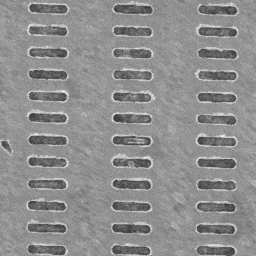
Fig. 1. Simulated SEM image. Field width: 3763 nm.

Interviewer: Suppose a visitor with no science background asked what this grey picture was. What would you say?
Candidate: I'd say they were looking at a regular array of holes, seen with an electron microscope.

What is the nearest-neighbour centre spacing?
0.32 microns